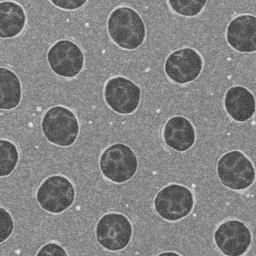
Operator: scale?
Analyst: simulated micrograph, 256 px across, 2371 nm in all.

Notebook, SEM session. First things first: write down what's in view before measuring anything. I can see a regular array of holes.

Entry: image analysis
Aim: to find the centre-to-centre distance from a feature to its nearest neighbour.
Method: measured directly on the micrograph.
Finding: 0.623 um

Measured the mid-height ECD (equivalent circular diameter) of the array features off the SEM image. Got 0.346 micrometres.